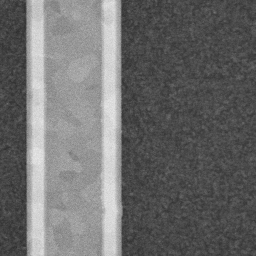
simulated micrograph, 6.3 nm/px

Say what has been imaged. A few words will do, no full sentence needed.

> one or a few lines or trenches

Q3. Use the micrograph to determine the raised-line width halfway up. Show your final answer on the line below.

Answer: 72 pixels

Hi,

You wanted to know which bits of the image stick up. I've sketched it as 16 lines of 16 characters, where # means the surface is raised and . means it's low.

..#####.........
..#####.........
..#####.........
..#####.........
..#####.........
..#####.........
..#####.........
..#####.........
..#####.........
..#####.........
..#####.........
..#####.........
..#####.........
..#####.........
..#####.........
..#####.........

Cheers